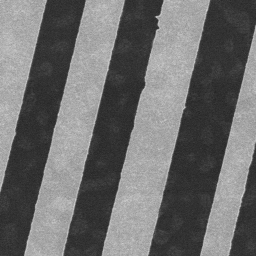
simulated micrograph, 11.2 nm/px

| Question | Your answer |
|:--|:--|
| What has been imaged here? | one or a few lines or trenches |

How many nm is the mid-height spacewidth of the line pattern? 431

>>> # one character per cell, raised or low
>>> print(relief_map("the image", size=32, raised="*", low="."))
******.....****.....******......
*****.....*****.....******......
*****.....*****.....******..*.*.
*****.....*****.....*****.....*.
*****.....****.....******.......
****...*.*****.*...******......*
****.....*****.....******......*
****.....*****.....******......*
****.....*****....******.......*
****....*****.....******......**
***.....*****.....******......**
***.....*****.....*****.......**
***.....*****....******......***
***.....****.....******......***
**.....*****.....******......***
**.....*****.....*****.......***
**.....*****.....*****.......***
**.....****.....******.......***
*.....*****.....******......****
*.....*****.....******......****
*.....*****.....*****.......***.
*.....****.....******.......***.
.....*****.....******......****.
.....******....******......****.
.....*****.....*****.......***..
.....****.....******.......***..
....*****.....******......****..
....*****.....******......****..
....*****.....******......***...
....****.....********.....***...
...*****.....******......****...
...*****.....******......****...